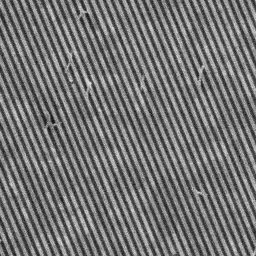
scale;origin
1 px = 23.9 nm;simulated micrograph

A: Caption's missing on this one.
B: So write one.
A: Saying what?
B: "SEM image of parallel lines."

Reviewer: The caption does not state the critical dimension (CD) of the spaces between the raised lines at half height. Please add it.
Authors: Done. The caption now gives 102 nm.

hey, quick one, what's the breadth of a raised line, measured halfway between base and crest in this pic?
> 0.0608 µm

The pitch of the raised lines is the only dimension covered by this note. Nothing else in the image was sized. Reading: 0.172 micrometres